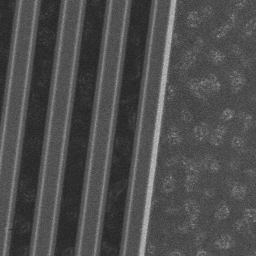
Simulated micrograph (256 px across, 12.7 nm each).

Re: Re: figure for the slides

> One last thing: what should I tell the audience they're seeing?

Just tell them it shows parallel lines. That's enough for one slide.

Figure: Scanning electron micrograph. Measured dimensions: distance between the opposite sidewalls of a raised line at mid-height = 248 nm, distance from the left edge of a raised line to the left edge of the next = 568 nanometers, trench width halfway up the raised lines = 0.324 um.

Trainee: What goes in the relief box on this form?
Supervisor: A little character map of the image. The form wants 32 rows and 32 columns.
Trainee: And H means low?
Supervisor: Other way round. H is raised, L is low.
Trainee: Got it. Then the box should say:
LLHHHLLLHHLLLLHHLLLHHHLLLLLLLLLL
LLHHHLLLHHLLLLHHLLLHHHLLLLLLLLLL
LLHHHLLLHHLLLHHHLLLHHLLLLLLLLLLL
LLHHLLLLHHLLLHHHLLLHHLLLLLLLLLLL
LLHHLLLHHHLLLHHHLLLHHLLLLLLLLLLL
LLHHLLLHHHLLLHHLLLLHHLLLLLLLLLLL
LLHHLLLHHHLLLHHLLLHHHLLLLLLLLLLL
LHHHLLLHHHLLLHHLLLHHHLLLLLLLLLLL
LHHHLLLHHLLLLHHLLLHHHLLLLLLLLLLL
LHHHLLLHHLLLLHHLLLHHHLLLLLLLLLLL
LHHLLLLHHLLLHHHLLLHHLLLLLLLLLLLL
LHHLLLLHHLLLHHHLLLHHLLLLLLLLLLLL
LHHLLLHHHLLLHHLLLLHHLLLLLLLLLLLL
LHHLLLHHHLLLHHLLLLHHLLLLLLLLLLLL
LHHLLLHHHLLLHHLLLHHHLLLLLLLLLLLL
HHHLLLHHLLLLHHLLLHHHLLLLLLLLLLLL
HHHLLLHHLLLLHHLLLHHHLLLLLLLLLLLL
HHHLLLHHLLLLHHLLLHHHLLLLLLLLLLLL
HHLLLLHHLLLHHHLLLHHLLLLLLLLLLLLL
HHLLLLHHLLLHHHLLLHHLLLLLLLLLLLLL
HHLLLHHHLLLHHLLLLHHLLLLLLLLLLLLL
HHLLLHHHLLLHHLLLLHHLLLLLLLLLLLLL
HHLLLHHHLLLHHLLLHHHLLLLLLLLLLLLL
HHLLLHHLLLLHHLLLHHHLLLLLLLLLLLLL
HHLLLHHLLLLHHLLLHHHLLLLLLLLLLLLL
HHLLLHHLLLLHHLLLHHHLLLLLLLLLLLLL
HLLLLHHLLLHHHLLLHHLLLLLLLLLLLLLL
HLLLLHHLLLHHHLLLHHLLLLLLLLLLLLLL
HLLLHHHLLLHHLLLLHHLLLLLLLLLLLLLL
HLLLHHHLLLHHLLLLHHLLLLLLLLLLLLLL
HLLLHHHLLLHHLLLHHHLLLLLLLLLLLLLL
HLLLHHLLLLHHLLLHHHLLLLLLLLLLLLLL